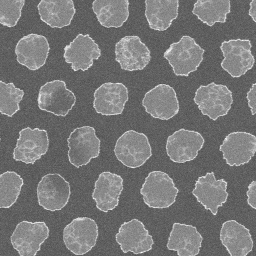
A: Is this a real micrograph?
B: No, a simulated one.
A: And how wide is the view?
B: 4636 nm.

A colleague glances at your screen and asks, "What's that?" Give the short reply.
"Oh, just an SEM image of a regular array of raised bodies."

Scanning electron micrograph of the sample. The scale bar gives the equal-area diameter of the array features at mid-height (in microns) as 0.623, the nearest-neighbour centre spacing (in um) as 0.899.